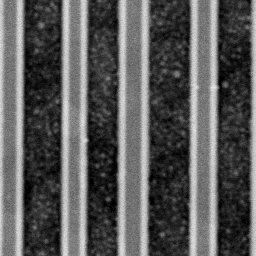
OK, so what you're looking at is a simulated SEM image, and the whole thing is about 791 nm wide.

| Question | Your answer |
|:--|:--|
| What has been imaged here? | one or a few lines or trenches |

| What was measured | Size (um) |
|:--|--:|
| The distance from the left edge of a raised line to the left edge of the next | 0.199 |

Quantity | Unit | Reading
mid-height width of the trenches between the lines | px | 46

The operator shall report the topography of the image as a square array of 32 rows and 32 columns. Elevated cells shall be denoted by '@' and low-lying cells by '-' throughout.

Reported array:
@@------@@-----@@@------@@@-----
@@------@@-----@@@------@@@-----
@@------@@-----@@@------@@@-----
@@------@@-----@@@------@@@-----
@@------@@-----@@@------@@@-----
@@------@@-----@@@------@@@-----
@@------@@-----@@@------@@@-----
@@------@@-----@@@------@@@-----
@@------@@-----@@@------@@@-----
@@------@@-----@@@------@@@-----
@@------@@-----@@@------@@@-----
@@------@@-----@@@------@@@-----
@@------@@-----@@@------@@@-----
@@------@@-----@@@------@@@-----
@@------@@-----@@@------@@@-----
@@------@@-----@@@------@@@-----
@@------@@-----@@@------@@@-----
@@------@@-----@@@------@@@-----
@@------@@-----@@@------@@@-----
@@------@@-----@@@------@@@-----
@@------@@-----@@@------@@@-----
@@------@@-----@@@------@@@-----
@@------@@-----@@@------@@@-----
@@------@@-----@@@------@@@-----
@@------@@-----@@@------@@@-----
@@------@@-----@@@------@@@-----
@@------@@-----@@@------@@@-----
@@------@@-----@@@------@@@-----
@@------@@-----@@@------@@@-----
@@------@@-----@@@------@@@-----
@@------@@-----@@@------@@@-----
@@------@@-----@@@------@@@-----